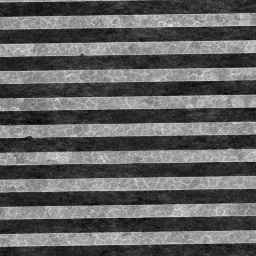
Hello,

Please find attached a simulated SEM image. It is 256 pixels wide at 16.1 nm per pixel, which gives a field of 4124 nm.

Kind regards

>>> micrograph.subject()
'parallel lines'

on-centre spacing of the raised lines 438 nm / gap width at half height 0.242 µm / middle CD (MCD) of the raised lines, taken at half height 0.189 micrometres